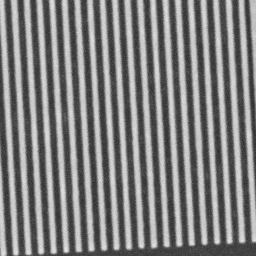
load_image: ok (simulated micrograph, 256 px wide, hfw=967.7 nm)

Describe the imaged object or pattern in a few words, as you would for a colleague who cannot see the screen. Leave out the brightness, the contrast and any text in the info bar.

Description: parallel lines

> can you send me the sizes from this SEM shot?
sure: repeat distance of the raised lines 0.0476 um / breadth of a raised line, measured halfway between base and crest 0.0179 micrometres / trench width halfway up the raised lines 7.62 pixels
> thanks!